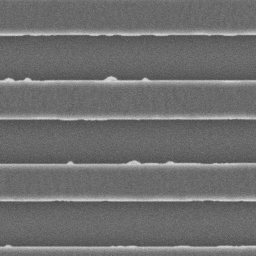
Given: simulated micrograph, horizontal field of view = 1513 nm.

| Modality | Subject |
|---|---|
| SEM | lines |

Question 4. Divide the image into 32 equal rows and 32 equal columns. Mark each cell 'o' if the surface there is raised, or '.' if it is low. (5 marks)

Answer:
oooooooooooooooooooooooooooooooo
oooooooooooooooooooooooooooooooo
oooooooooooooooooooooooooooooooo
oooooooooooooooooooooooooooooooo
................................
................................
................................
................................
................................
................................
oooooooooooooooooooooooooooooooo
oooooooooooooooooooooooooooooooo
oooooooooooooooooooooooooooooooo
oooooooooooooooooooooooooooooooo
oooooooooooooooooooooooooooooooo
................................
................................
................................
................................
................................
...............oo.oo.oooo.oooooo
oooooooooooooooooooooooooooooooo
oooooooooooooooooooooooooooooooo
oooooooooooooooooooooooooooooooo
oooooooooooooooooooooooooooooooo
................................
................................
................................
................................
................................
................................
oooooooooooooooooooooooooooooooo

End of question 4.